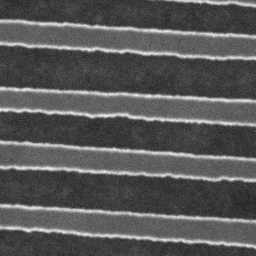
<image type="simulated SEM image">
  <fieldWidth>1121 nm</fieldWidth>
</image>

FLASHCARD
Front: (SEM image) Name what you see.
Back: lines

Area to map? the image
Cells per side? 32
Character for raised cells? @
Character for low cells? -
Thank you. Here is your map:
------------------------------@@
--------------------------------
--------------------------------
@@@@@@@@@@@@@@@@@---------------
@@@@@@@@@@@@@@@@@@@@@@@@@@@@@@@-
@@@@@@@@@@@@@@@@@@@@@@@@@@@@@@@@
----------------@@@@@@@@@@@@@@@@
--------------------------------
--------------------------------
--------------------------------
--------------------------------
@@@@@@@@@@@---------------------
@@@@@@@@@@@@@@@@@@@@@@@@@@@@@@@@
@@@@@@@@@@@@@@@@@@@@@@@@@@@@@@@@
-----------@@@-@@@@@@@@@@@@@@@@@
----------------------------@@@@
--------------------------------
--------------------------------
@@@@@@@@@@@@--------------------
@@@@@@@@@@@@@@@@@@@@@@@@@-------
@@@@@@@@@@@@@@@@@@@@@@@@@@@@@@@@
-----------@@@@@@@@@@@@@@@@@@@@@
--------------------------@@@@@@
--------------------------------
--------------------------------
--------------------------------
@@@@@@@@@@@@@@------------------
@@@@@@@@@@@@@@@@@@@@@@@@@@@@@@@-
@@@@@@@@@@@@@@@@@@@@@@@@@@@@@@@@
------------@@@@@@@@@@@@@@@@@@@@
----------------------------@@@@
--------------------------------